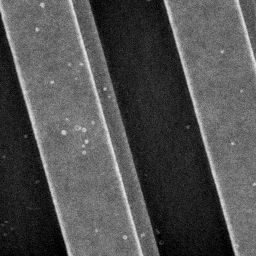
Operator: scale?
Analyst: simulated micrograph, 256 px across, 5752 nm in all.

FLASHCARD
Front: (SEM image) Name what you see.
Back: lines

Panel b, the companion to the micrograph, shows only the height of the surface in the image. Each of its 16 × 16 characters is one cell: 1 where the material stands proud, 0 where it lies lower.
1111110000111111
1111110000011111
0111110000011111
0111110000011111
0111111000001111
0111111000001111
0011111000001111
0011111100001111
0011111100000111
0011111100000111
0001111100000111
0001111110000111
0001111110000011
0000111110000011
0000111111000011
0000111111000001